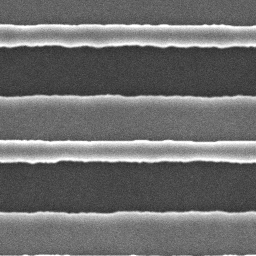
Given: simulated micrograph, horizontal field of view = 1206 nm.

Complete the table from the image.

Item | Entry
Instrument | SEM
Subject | lines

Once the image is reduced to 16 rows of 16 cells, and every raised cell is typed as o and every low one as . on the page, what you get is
oooooooooooooooo
oooooooooooooooo
oooooooooooooooo
................
................
................
oooooooooooooooo
oooooooooooooooo
oooooooooooooooo
oooooooooooooooo
................
................
................
oooooooooooooooo
oooooooooooooooo
oooooooooooooooo